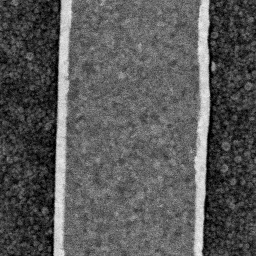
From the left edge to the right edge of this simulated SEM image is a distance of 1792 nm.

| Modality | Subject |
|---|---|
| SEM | one or a few lines or trenches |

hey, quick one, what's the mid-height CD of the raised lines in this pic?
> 998 nanometers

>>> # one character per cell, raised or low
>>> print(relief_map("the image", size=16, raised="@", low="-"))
----@@@@@@@@@---
----@@@@@@@@@---
----@@@@@@@@@---
----@@@@@@@@@---
----@@@@@@@@@---
----@@@@@@@@@---
----@@@@@@@@@---
----@@@@@@@@@---
----@@@@@@@@@---
----@@@@@@@@@---
----@@@@@@@@@---
----@@@@@@@@@---
----@@@@@@@@@---
----@@@@@@@@@---
----@@@@@@@@----
----@@@@@@@@----